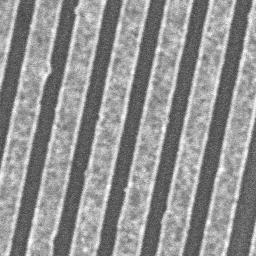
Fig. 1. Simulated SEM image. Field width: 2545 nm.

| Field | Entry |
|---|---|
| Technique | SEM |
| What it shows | parallel lines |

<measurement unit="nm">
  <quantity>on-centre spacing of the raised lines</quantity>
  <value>422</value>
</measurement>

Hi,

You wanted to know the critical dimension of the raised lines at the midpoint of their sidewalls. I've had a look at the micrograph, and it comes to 221 nm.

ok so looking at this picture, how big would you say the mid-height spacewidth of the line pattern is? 202 nm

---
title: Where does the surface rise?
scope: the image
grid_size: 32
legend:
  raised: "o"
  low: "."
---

oo...oo...ooo...oo...ooo..ooo...
oo..ooo...ooo..ooo...ooo..ooo..o
oo..ooo...oo...ooo...oo...ooo..o
o...ooo..ooo...ooo..ooo...ooo..o
o...ooo..ooo...ooo..ooo..ooo...o
o...oo...ooo..ooo...ooo..ooo...o
o..ooo...ooo..ooo...ooo..ooo..oo
o..ooo...oo...ooo..ooo...ooo..oo
...ooo..ooo...ooo..ooo...oo...oo
...ooo..ooo...oo...ooo..ooo...oo
...oo...ooo..ooo...ooo..ooo...oo
..ooo...ooo..ooo...oo...ooo..ooo
..ooo...oo...ooo..ooo...ooo..ooo
..ooo..ooo...ooo..ooo...oo...ooo
..ooo..ooo...ooo..ooo..ooo...ooo
.ooo...ooo..ooo...ooo..ooo...oo.
.ooo...ooo..ooo...oo...ooo..ooo.
.ooo..ooo...ooo..ooo...ooo..ooo.
.ooo..ooo...ooo..ooo...oo...ooo.
.oo...ooo...oo...ooo..ooo...ooo.
ooo...ooo..ooo...ooo..ooo...oo..
ooo...oo...ooo..ooo...ooo..ooo..
ooo..ooo...ooo..ooo...ooo..ooo..
ooo..ooo...ooo..ooo...oo...ooo..
oo...ooo..ooo...ooo..ooo...ooo..
oo...ooo..ooo...ooo..ooo..ooo...
oo...oo...ooo..ooo...ooo..ooo...
oo..ooo...ooo..ooo...oo...ooo...
oo..ooo...oo...ooo..ooo...ooo...
o...ooo..ooo...ooo..ooo...oo....
o...oo...ooo...oo...ooo..ooo....
o...oo...ooo..ooo...ooo..ooo...o